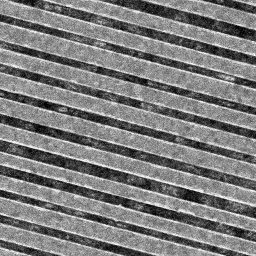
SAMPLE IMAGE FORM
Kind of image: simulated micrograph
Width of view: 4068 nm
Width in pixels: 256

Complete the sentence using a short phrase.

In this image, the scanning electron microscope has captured parallel lines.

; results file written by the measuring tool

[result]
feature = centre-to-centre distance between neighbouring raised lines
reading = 384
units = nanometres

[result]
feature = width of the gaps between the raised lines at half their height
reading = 140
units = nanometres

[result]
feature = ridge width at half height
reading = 0.232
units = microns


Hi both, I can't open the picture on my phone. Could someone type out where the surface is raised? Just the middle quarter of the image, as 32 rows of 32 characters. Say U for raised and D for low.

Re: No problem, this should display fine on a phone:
UDDDDDDDDUUUUUUUUUUUUUUUUUDDDDDD
UUUUUDDDDDDDUUUUUUUUUUUUUUUUUDDD
UUUUUUUUDDDDDDDDUUUUUUUUUUUUUUUU
UUUUUUUUUUUUDDDDDDDDUUUUUUUUUUUU
DDUUUUUUUUUUUUUUDDDDDDDDUUUUUUUU
DDDDDDUUUUUUUUUUUUUUDDDDDDDDUUUU
UDDDDDDDDUUUUUUUUUUUUUUUDDDDDDDU
UUUUDDDDDDDDDUUUUUUUUUUUUUUDDDDD
UUUUUUUUDDDDDDDDDUUUUUUUUUUUUUUD
UUUUUUUUUUUUDDDDDDDDDUUUUUUUUUUU
DUUUUUUUUUUUUUUUDDDDDDDDDUUUUUUU
DDDDDUUUUUUUUUUUUUUUDDDDDDDDUUUU
DDDDDDDDUUUUUUUUUUUUUUUDDDDDDDDD
UUUDDDDDDDDDUUUUUUUUUUUUUUUDDDDD
UUUUUUUDDDDDDDDDUUUUUUUUUUUUUUUD
UUUUUUUUUUUDDDDDDDDDUUUUUUUUUUUU
UUUUUUUUUUUUUUUDDDDDDDDDUUUUUUUU
DDDUUUUUUUUUUUUUUUUDDDDDDDDUUUUU
DDDDDDDUUUUUUUUUUUUUUUDDDDDDDDDU
UDDDDDDDDDDUUUUUUUUUUUUUUUDDDDDD
UUUUUDDDDDDDDDDUUUUUUUUUUUUUUUDD
UUUUUUUUUDDDDDDDDDDUUUUUUUUUUUUU
UUUUUUUUUUUUUDDDDDDDDDUUUUUUUUUU
DDUUUUUUUUUUUUUUUDDDDDDDDDUUUUUU
DDDDDDUUUUUUUUUUUUUUDDDDDDDDDDUU
DDDDDDDDDDUUUUUUUUUUUUUUDDDDDDDD
UDDDDDDDDDDDDDUUUUUUUUUUUUUUDDDD
UUUUUDDDDDDDDDDDDDUUUUUUUUUUUUUU
UUUUUUUUUDDDDDDDDDDDDUUUUUUUUUUU
DUUUUUUUUUUUUDDDDDDDDDDDDUUUUUUU
DDDDDUUUUUUUUUUUDDDDDDDDDDDDDUUU
DDDDDDDDUUUUUUUUUUUUDDDDDDDDDDDD